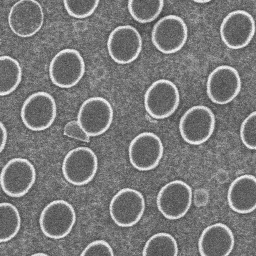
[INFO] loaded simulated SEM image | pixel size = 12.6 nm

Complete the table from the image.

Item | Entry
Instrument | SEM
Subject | a regular array of raised bodies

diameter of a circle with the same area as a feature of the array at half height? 432 nm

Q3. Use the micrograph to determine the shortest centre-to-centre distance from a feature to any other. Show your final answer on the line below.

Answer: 48.3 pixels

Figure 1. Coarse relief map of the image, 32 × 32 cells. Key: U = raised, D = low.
DDUUUDDDUUUUDDDDUUUUDDDDDDDDDDDD
DDDUUDDDDUUDDDDDUUUUDDDDDDDDDDDD
DDUUUDDDDDDDDDDDDUUDUUUDDDDDUUUU
DDUUUDDDDDDDDDDUUDDUUUUDDDDDUUUU
DDDDDDDDDDDDDDUUUDDUUUUDDDDDUUUD
DDDDDDDDDDDDDDUUUUDUUUUDDDDDUUUD
DDDDDDDDUDDDDDUUUDDDDDDDDDDDDDDD
UUDDDDDUUUDDDDUUDDDDDDDDDDDDDDDD
UUDDDDUUUUDDDDDDDDDDDDDDDDDUUDDD
UUDDDDUUUUDDDDDDDDDDDDDDDDUUUUDD
UUDDDDDUUDDDDDDDDDDUUDDDDDUUUUDD
UDDDDDDDDDDDDDDDDDDUUUDDDDUUUUDD
DDDDUUUDDDDUUDDDDDUUUUDDDDDUUDDD
DDDUUUUDDDUUUUDDDDUUUUDDUDDDDDDD
DDDUUUUDDDUUUUDDDDDUUDDUUUUDDDDU
DDDUUUDDDDUUUUDDDDDDDDDUUUUDDDUU
UDDDDDDDDUUUUDDDDDDDDDDUUUDDDDUU
UDDDDDDDDDDDDDDDDUUUDDDUUUDDDDUU
DDDDDDDDDDDDDDDDUUUUDDDDDDDDDDDD
DDDDDDDDUUUUDDDDUUUUDDDDDDDDDDDD
DUUUDDDDUUUUDDDDDUUDDDDDDDDDDDDD
UUUUDDDDUUUUDDDDDDDDDDDDDDDDDDDD
UUUUDDDDDUUDDDDDDDDDDDDDDDDDDDUU
UUUUDDDDDDDDDDDDDDDDDUUUDDDDDUUU
DDDDDDDDDDDDDDDUUUDDUUUUDDDDDUUU
UDDDDDUUDDDDDDUUUUDDUUUUDDDDDUUU
UUDDDUUUUDDDDDUUUUDDUUUDDDDDDDDD
UUDDDUUUUDDDDDUUUDDDDDDDDDDDDDDD
UUDDDUUUUDDDDDDDDDDDDDDDDDUUDDDD
UUDDDDUUDDDDDDDDDDDUUDDDDUUUUDDD
DDDDDDDDDDDDUDDDDDUUUUDDDUUUUDDD
DDDDDDDDDDDUUUDDDDUUUUDDDUUUUDDD